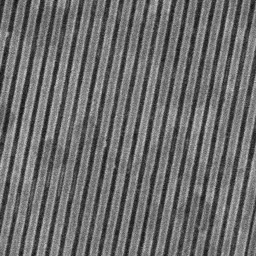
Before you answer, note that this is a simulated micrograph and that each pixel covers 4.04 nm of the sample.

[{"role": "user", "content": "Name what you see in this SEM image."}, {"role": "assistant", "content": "parallel lines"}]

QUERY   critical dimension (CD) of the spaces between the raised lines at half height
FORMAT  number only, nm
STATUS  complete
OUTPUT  22.3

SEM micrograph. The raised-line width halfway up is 29.3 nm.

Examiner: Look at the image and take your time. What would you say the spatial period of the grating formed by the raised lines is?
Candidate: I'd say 13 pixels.